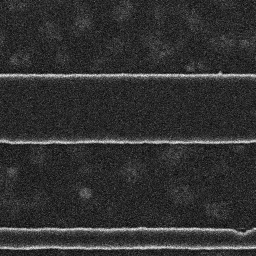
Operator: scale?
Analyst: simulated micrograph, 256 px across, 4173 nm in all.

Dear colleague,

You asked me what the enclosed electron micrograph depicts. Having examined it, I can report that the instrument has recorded one or a few lines or trenches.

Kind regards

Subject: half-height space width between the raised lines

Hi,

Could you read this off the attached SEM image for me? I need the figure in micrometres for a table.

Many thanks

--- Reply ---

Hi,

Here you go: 1.42